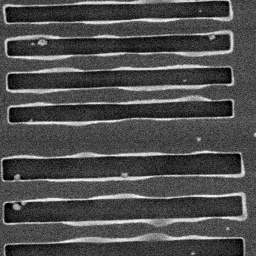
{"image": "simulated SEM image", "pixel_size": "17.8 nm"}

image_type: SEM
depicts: groups of lines, slits or small figures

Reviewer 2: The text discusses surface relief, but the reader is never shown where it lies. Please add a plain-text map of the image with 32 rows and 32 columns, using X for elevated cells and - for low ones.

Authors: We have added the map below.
XXXXXXXXXX-------------------XXX
X----------------------------XXX
X--------------------XXXXXXXXXXX
XXXXXXXXXXXXXXXXXXXXXXXXXXXXXXXX
XXXXXXXXXXXXXXXXXXXX---------XXX
X----------------------------XXX
X---------------------------XXXX
XXXXXXXXXXXXXXXXXXXXXXXXXXXXXXXX
XXXXXXXXXXXXXXXXXXXX---------XXX
X----------------------------XXX
X----------------------------XXX
XXXXXXXXXXXXXXXXXXXXXXXXXXXXXXXX
XXXXXXXXXXXXXXXXXXXXXXX---XXXXXX
X----------------------------XXX
X----------------------------XXX
XXXXXXXXXXXXXXXXXXXXXXXXXXXXXXXX
XXXXXXXXXXXXXXXXXXXXXXXXXXXXXXXX
XXXXXXXXXXXXXXXXXXXXXXXXXXXXXXXX
XXXXXXXXXXXXXXXXXXXXXXXXXXXXXXXX
XXXXXXXXXX--------------------XX
------------------------------XX
------------------------------XX
XXX-XXX--XXXXXXXXXXXXXXXXXXXXXXX
XXXXXXXXXXXXXXXXXXXXXXXXXXXXXXXX
XXXXXXXXXXXXXXX--XXXXXXX------XX
X------------------------------X
-------------------------------X
------------------------XXXXXXXX
XXXXXXXXXXXXXXXXXXXXXXXXXXXXXXXX
XXXXXXXXXXXXXXXXXXX-XXXXXXXXXXXX
X------------------------------X
X------------------------------X